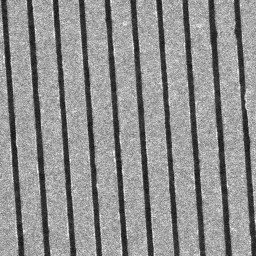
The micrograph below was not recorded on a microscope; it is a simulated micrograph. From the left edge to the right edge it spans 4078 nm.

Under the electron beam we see parallel lines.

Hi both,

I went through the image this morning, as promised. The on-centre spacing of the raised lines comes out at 0.412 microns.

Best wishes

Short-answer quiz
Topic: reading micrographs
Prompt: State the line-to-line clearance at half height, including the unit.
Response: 95.4 nanometers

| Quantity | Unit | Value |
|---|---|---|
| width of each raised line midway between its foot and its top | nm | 312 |